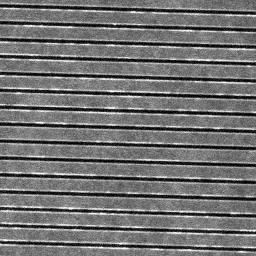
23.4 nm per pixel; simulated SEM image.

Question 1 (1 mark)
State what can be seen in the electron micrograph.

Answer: parallel lines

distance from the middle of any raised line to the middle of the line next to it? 395 nanometres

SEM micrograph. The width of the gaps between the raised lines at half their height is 96.4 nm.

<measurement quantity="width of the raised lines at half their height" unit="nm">298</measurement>